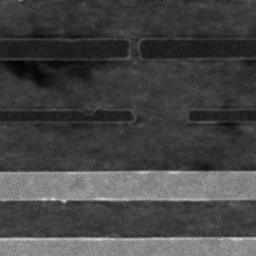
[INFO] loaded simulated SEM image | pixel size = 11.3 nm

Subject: one or a few lines or trenches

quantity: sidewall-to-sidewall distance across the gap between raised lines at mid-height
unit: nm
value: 561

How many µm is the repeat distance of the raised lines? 0.776